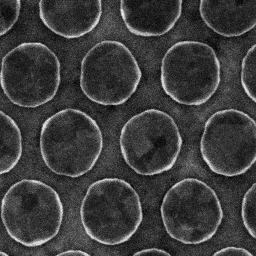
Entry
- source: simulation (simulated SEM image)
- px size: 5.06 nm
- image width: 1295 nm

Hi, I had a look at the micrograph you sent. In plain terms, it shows a regular array of raised bodies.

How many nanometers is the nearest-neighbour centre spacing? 401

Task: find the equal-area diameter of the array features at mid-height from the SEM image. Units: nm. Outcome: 314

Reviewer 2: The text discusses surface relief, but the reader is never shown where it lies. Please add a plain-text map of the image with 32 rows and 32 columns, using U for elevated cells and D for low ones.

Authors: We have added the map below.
UUDDDUUUUUUUUDDUUUUUUUUDDUUUUUUU
UUDDDUUUUUUUUDDUUUUUUUDDDUUUUUUU
UUDDDUUUUUUUDDDDUUUUUUDDDUUUUUUU
UDDDDDUUUUUDDDDDUUUUUDDDDDUUUUUD
DDDDDDDDUUDDDDDDDDDDDDDDDDDDDDDD
DDDDUDDDDDDDUUUDDDDDDDUUUUDDDDDD
DUUUUUUDDDDUUUUUDDDDDUUUUUUDDDDU
UUUUUUUDDDUUUUUUUDDDUUUUUUUDDDUU
UUUUUUUDDDUUUUUUUDDDUUUUUUUDDDUU
UUUUUUUDDDUUUUUUUDDDUUUUUUUDDDUU
UUUUUUUDDDUUUUUUUDDDUUUUUUUDDDUU
DUUUUUUDDDUUUUUUUDDDDUUUUUUDDDDU
DUUUUUDDDDDDUUUUDDDDDDUUUUDDDDDD
DDDDDDDDDDDDDDDDDDDDDDDDDDDDDDDD
UDDDDDDUUUUDDDDDDUUUUDDDDDDUUUUD
UUDDDDUUUUUUDDDDUUUUUUDDDDUUUUUU
UUDDDUUUUUUUUDDUUUUUUUDDDDUUUUUU
UUUDDUUUUUUUUDDUUUUUUUDDDUUUUUUU
UUUDDUUUUUUUUDDUUUUUUUDDDUUUUUUU
UUDDDUUUUUUUDDDDUUUUUUDDDUUUUUUU
UUDDDDUUUUUUDDDDUUUUUDDDDDUUUUUD
UDDDDDDUUUUDDDDDDUUUDDDDDDDUUUDD
DDDUDDDDDDDDDUUDDDDDDDDUUDDDDDDD
DUUUUUDDDDDUUUUUUDDDDUUUUUDDDDDU
DUUUUUUDDDDUUUUUUDDDDUUUUUUDDDDU
UUUUUUUUDDUUUUUUUDDDUUUUUUUDDDUU
UUUUUUUUDDUUUUUUUUDDUUUUUUUUDDUU
UUUUUUUUDDUUUUUUUUDDUUUUUUUUDDDU
DUUUUUUDDDDUUUUUUDDDDUUUUUUDDDDU
DDUUUUUDDDDUUUUUDDDDDUUUUUDDDDDD
DDDUDDDDDDDDDDDDDDDDDDDDDDDDDDDD
DDDDDDDDDUDDDDDDDDUUDDDDDDDUUUUD